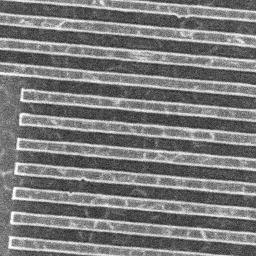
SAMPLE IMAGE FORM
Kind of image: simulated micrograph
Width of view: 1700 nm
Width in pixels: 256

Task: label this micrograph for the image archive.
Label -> parallel lines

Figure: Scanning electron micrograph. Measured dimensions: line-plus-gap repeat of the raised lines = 164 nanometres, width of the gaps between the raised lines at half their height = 94.3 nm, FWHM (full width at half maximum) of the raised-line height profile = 71.1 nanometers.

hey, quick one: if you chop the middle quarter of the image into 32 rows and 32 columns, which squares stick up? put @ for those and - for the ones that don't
--------------------------------
@@------------------------------
@@@@@@@@@@@@@@------------------
@@@@@@@@@@@@@@@@@@@@@@@@@-------
--------@@@@@@@@@@@@@@@@@@@@@@@@
---------------------@@@@@@@@@@@
-------------------------------@
@-------------------------------
@@@@@@@@@@@---------------------
@@@@@@@@@@@@@@@@@@@@@@----------
-----@@@@@@@@@@@@@@@@@@@@@@@@@@@
-----------------@-@@@@@@@@@@@@@
----------------------------@@@@
--------------------------------
@@@@@@@@@@----------------------
@@@@@@@@@@@@@@@@@@@@@@----------
-----@@@@@@@@@@@@@@@@@@@@@@@@@@@
-----------------@@@@@@@@@@@@@@@
----------------------------@@@@
--------------------------------
@@@@@@@@@@----------------------
@@@@@@@@@@@@@@@@@@@-------------
--@@@@@@@@@@@@@@@@@@@@@@@@@@@@@@
-------------@@@@@@@@@@@@@@@@@@@
-------------------------@@@@@@@
--------------------------------
@@@@@@@-------------------------
@@@@@@@@@@@@@@@@@@--------------
@@@@@@@@@@@@@@@@@@@@@@@@@@@@@@--
-----------@@@@@@@@@@@@@@@@@@@@@
-------------------------@@@@@@@
--------------------------------